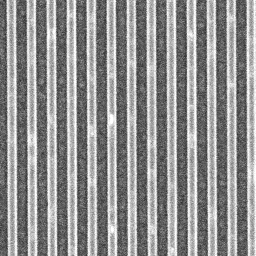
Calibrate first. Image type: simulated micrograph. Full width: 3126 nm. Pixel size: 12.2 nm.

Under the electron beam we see parallel lines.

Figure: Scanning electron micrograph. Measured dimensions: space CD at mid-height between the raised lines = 142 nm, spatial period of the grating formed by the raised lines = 244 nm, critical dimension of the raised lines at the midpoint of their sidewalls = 94.7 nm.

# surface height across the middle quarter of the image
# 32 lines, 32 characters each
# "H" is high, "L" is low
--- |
LHHLLLHHLLLHHLLLHHLLLHHLLLHHLLLH
LHHLLLHHLLLHHLLLHHLLLHHLLLHHLLLH
LHHLLLHHLLLHHLLLHHLLLHHLLLHHLLLH
LHHLLLHHLLLHHLLLHHLLLHHLLLHHLLLH
LHHLLLHHLLLHHLLLHHLLLHHLLLHHLLLH
LHHLLLHHLLLHHLLLHHLLLHHLLLHHLLLH
LHHLLLHHLLLHHLLLHHLLLHHLLLHHLLLH
LHHLLLHHLLLHHLLLHHLLLHHLLLHHLLLH
LHHLLLHHLLLHHLLLHHLLLHHLLLHHLLLH
LHHLLLHHLLLHHLLLHHLLLHHLLLHHLLLH
LHHLLLHHLLLHHLLLHHLLLHHLLLHHLLLH
LHHLLLHHLLLHHLLLHHLLLHHLLLHHLLLH
LHHLLLHHLLLHHLLLHHLLLHHLLLHHLLLH
LHHLLLHHLLLHHLLLHHLLLHHLLLHHLLLH
LHHLLLHHLLLHHLLLHHLLLHHLLLHHLLLH
LHHLLLHHLLLHHLLLHHLLLHHLLLHHLLLH
LHHLLLHHLLLHHLLLHHLLLHHLLLHHLLLH
LHHLLLHHLLLHHLLLHHLLLHHLLLHHLLLH
LHHLLLHHLLLHHLLLHHLLLHHLLLHHLLLH
LHHLLLHHLLLHHLLLHHLLLHHLLLHHLLLH
LHHLLLHHLLLHHLLLHHLLLHHLLLHHLLLH
LHHLLLHHLLLHHLLLHHLLLHHLLLHHLLLH
LHHLLLHHLLLHHLLLHHLLLHHLLLHHLLLH
LHHLLLHHLLLHHLLLHHLLLHHLLLHHLLLH
LHHLLLHHLLLHHLLLHHLLLHHLLLHHLLLH
LHHLLLHHLLLHHLLLHHLLLHHLLLHHLLLH
LHHLLLHHLLLHHLLLHHLLLHHLLLHHLLLH
LHHLLLHHLLLHHLLLHHLLLHHLLLHHLLLH
LHHLLLHHLLLHHLLLHHLLLHHLLLHHLLLH
LHHLLLHHLLLHHLLLHHLLLHHLLLHHLLLH
LHHLLLHHLLLHHLLLHHLLLHHLLLHHLLLH
LHHLLLHHLLLHHLLLHHLLLHHLLLHHLLLH